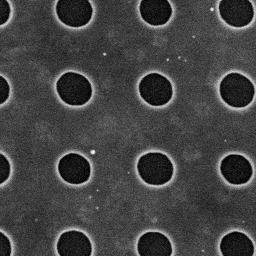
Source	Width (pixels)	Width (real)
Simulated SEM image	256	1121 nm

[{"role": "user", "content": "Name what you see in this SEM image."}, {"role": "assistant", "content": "holes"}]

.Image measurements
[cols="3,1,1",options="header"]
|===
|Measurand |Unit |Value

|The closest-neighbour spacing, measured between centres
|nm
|346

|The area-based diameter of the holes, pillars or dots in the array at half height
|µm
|0.149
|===